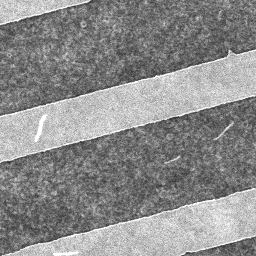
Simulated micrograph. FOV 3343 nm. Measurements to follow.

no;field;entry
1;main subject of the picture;one or a few lines or trenches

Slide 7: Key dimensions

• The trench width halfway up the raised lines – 1170 nm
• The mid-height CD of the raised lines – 44 pixels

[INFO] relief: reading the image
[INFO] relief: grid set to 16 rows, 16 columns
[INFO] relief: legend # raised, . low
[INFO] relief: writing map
####............
................
................
..............##
...........#####
.......#########
...###########..
##########......
######..........
##..............
................
................
.............###
.........#######
......##########
..###########...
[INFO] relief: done